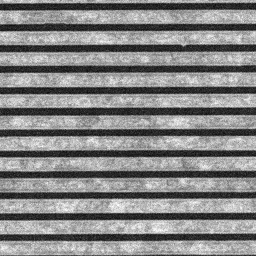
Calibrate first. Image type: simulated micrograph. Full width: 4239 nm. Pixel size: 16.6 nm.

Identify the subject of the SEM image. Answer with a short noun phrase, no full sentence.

parallel lines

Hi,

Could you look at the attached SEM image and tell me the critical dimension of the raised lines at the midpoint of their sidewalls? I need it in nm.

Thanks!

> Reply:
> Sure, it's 217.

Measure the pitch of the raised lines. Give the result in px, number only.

21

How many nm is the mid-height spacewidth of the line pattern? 139